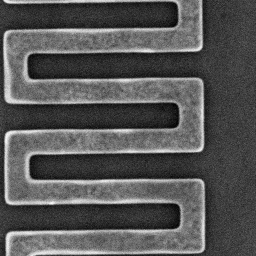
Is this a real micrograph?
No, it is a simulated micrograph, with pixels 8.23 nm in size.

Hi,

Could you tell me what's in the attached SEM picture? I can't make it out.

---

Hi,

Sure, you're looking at groups of lines, slits or small figures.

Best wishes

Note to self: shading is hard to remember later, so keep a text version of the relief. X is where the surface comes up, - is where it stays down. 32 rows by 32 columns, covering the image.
----------------------XXX-------
----------------------XXX-------
----------------------XXX-------
---------------------XXXX-------
-XXXXXXXXXXXXXXXXXXXXXXXX-------
-XXXXXXXXXXXXXXXXXXXXXXXX-------
-XXXXXXXXXXXXX------------------
-XX-----------------------------
-XX-----------------------------
-XX-----------------------------
-XXXXXXXXXXXXXXXXXXXXXXXX-------
-XXXXXXXXXXXXXXXXXXXXXXXX-------
-XXXXXXXXXXXXXXXXXXXXXXXX-------
----------------------XXX-------
-----------------------XX-------
----------------------XXX-------
--XXXXXXXXXXXXXXXXXXXXXXX-------
-XXXXXXXXXXXXXXXXXXXXXXXX-------
-XXXXXXXXXXXXXXXXXXXXXXXX-------
-XXX----------------------------
-XX-----------------------------
-XX-----------------------------
-XXX-----------------XXXX-------
-XXXXXXXXXXXXXXXXXXXXXXXX-------
-XXXXXXXXXXXXXXXXXXXXXXXX-------
----------------------XXX-------
-----------------------XX-------
-----------------------XX-------
----------------------XXX-------
-XXXXXXXXXXXXXXXXXXXXXXXX-------
-XXXXXXXXXXXXXXXXXXXXXXXX-------
-XXXXXXXXXXXXXXXXXX--XXXX-------